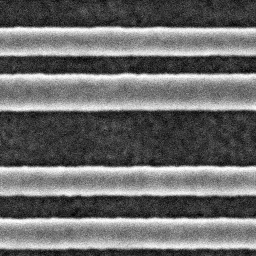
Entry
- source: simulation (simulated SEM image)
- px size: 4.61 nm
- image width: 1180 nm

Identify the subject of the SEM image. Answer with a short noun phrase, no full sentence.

lines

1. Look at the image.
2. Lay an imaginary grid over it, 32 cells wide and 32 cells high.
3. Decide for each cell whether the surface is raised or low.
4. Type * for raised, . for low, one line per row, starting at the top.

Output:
................................
................................
................................
............***....*............
********************************
********************************
********************************
................................
................................
********************************
********************************
********************************
********************************
********************************
................................
................................
................................
................................
................................
................................
................................
********************************
********************************
********************************
................................
................................
................................
********************************
********************************
********************************
********************************
................................